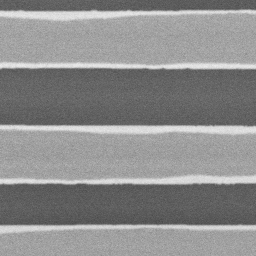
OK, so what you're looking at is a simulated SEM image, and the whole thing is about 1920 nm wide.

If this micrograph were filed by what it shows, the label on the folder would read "lines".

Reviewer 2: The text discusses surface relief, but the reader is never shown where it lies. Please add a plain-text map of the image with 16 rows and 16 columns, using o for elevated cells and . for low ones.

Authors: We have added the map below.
................
oooooooooooooooo
oooooooooooooooo
oooooooooooooooo
................
................
................
................
oooooooooooooooo
oooooooooooooooo
oooooooooooooooo
................
................
................
oooooooooooooooo
oooooooooooooooo